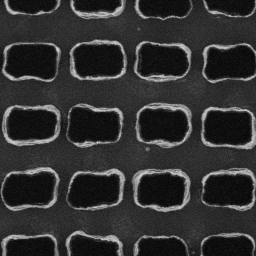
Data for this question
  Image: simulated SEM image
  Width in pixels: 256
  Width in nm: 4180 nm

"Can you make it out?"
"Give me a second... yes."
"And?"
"a regular array of raised bodies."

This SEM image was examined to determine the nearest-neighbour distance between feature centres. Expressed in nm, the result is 1040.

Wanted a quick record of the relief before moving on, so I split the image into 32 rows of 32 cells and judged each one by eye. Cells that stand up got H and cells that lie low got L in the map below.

LHHHHHHLLHHHHHHLLHHHHHHHLHHHHHHH
LLHHHHLLLLHHHHLLLHHHHHHHLLHHHHHH
LLLLLLLLLLLLLLLLLLLLLLLLLLLLLLLL
LLLLLLLLLLLLLLLLLLLLLLLLLLLLLLLL
LLLLLLLLLLLLLLLLLLLLLLLLLLLLLLLL
LLHHHHLLLLHHHHHLLLHHLHLLLLLLLLHL
LHHHHHHLLHHHHHHLLHHHHHHLLLHHHHHH
LHHHHHHLLHHHHHHHLHHHHHHHLLHHHHHH
HHHHHHHLLHHHHHHHLHHHHHHHLLHHHHHH
LHHHHHHLLLHHHHHLLHHHHHHLLLHHHHHH
LLLLLLLLLLLLLLLLLLLLLLLLLLLLLLLL
LLLLLLLLLLLLLLLLLLLLLLLLLLLLLLLL
LLLLLLLLLLLLLLLLLLLLLLLLLLLLLLLL
LHHHLLLLLHHLLLLLLLHHHHLLLLLLLLLL
LHHHHHHLLHHHHHHLLHHHHHHLLHHHHHHH
LHHHHHHLLHHHHHHLLHHHHHHHLHHHHHHH
LHHHHHHLHHHHHHHLLHHHHHHHLHHHHHHH
LHHHHHLLLHHHHHHLLLHHHHHLLHHHHHHH
LLLLLLLLLLLLLLLLLLLLLLLLLLLLLLLL
LLLLLLLLLLLLLLLLLLLLLLLLLLLLLLLL
LLLLLLLLLLLLLLLLLLLLLLLLLLLLLLLL
LLLLHHHLLLLLLLHLLLHLHHLLLLLLLLLL
LHHHHHHLLHHHHHHLLHHHHHHLLLHHHHHH
HHHHHHHLLHHHHHHLLHHHHHHHLHHHHHHH
HHHHHHHLHHHHHHHLLHHHHHHLLHHHHHHH
LHHHHHLLLHHHHHHLLHHHHHHLLLHHHHHL
LLLLLLLLLLLLLLLLLLLLLLLLLLLLLLLL
LLLLLLLLLLLLLLLLLLLLLLLLLLLLLLLL
LLLLLLLLLLLLLLLLLLLLLLLLLLLLLLLL
LLLLHHLLLHHLLLLLLLLLLLLLLLHHHHHL
LHHHHHHLHHHHHHHLLHHHHHHLLHHHHHHH
HHHHHHHLLHHHHHHLLHHHHHHLLHHHHHHH